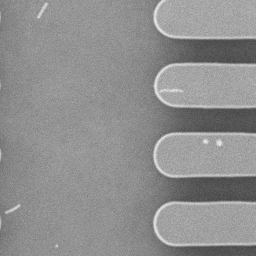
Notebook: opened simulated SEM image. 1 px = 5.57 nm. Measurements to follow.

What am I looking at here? groups of lines, slits or small figures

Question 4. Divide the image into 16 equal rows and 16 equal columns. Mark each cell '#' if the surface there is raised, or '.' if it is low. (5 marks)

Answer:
..........######
..........######
................
................
..........######
..........######
...........#####
................
..........######
..........######
..........######
................
................
..........######
..........######
................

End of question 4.